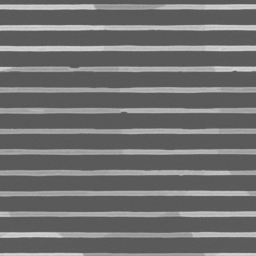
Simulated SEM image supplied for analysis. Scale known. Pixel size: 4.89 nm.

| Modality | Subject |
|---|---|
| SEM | parallel lines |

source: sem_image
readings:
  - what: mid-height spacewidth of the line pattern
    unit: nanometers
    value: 83.2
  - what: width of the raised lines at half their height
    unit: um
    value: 0.0177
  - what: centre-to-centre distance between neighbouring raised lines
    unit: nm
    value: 101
